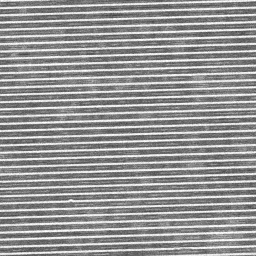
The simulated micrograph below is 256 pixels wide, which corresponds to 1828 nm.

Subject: parallel lines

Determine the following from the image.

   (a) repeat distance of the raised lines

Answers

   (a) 51.6 nm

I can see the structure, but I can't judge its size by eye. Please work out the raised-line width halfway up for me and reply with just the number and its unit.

0.0116 µm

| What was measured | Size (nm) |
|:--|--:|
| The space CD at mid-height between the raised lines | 36.6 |